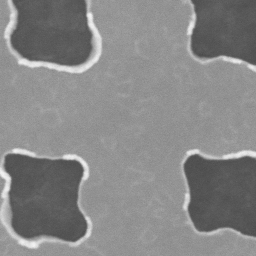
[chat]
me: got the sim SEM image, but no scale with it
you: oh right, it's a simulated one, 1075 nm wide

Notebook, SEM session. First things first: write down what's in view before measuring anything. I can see holes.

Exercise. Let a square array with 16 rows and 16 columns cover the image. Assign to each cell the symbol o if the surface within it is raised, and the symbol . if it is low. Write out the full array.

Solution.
o....ooooooo....
o.....oooooo....
o.....oooooo....
o.....oooooo....
oooooooooooooooo
oooooooooooooooo
oooooooooooooooo
oooooooooooooooo
oooooooooooooooo
oooooooooooooooo
.....ooooooo....
o....ooooooo....
o....ooooooo....
o....ooooooo....
o....oooooooooo.
oooooooooooooooo